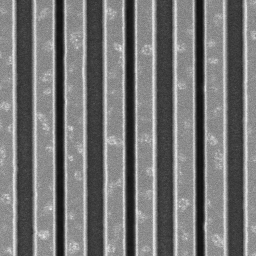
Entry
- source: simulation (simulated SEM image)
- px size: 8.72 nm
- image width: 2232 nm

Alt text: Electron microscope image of parallel lines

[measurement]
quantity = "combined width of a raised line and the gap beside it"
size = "297 nm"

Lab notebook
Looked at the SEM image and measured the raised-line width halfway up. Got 0.195 micrometres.